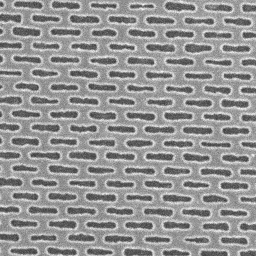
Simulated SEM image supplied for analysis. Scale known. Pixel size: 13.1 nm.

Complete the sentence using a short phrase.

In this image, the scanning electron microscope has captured a regular array of holes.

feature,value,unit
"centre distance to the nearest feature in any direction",293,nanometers